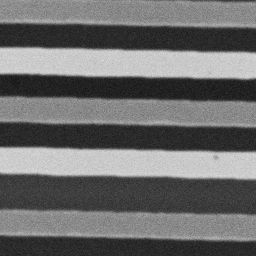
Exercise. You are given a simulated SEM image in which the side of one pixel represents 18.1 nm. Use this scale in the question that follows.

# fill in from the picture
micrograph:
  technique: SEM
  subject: lines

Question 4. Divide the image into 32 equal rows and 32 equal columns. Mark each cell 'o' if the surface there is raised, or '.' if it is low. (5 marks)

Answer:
oooooooooooooooooooooooooooooooo
oooooooooooooooooooooooooooooooo
oooooooooooooooooooooooooooooooo
................................
................................
................................
ooooooooooooooooooooooooo.......
oooooooooooooooooooooooooooooooo
oooooooooooooooooooooooooooooooo
..............o..ooooooooooooooo
................................
................................
oooooooooooooo..................
oooooooooooooooooooooooooooooooo
oooooooooooooooooooooooooooooooo
..............oooooooooooooooooo
................................
................................
................................
oooooooooooooooooooooooooooooooo
oooooooooooooooooooooooooooooooo
oooooooooooooooooooooooooooooooo
................................
................................
................................
................................
ooooooooooo.....................
oooooooooooooooooooooooooooooooo
oooooooooooooooooooooooooooooooo
.........ooooooooooooooooooooooo
................................
................................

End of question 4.